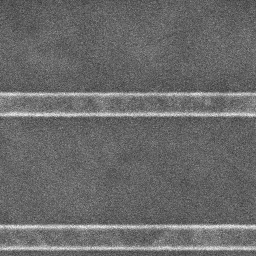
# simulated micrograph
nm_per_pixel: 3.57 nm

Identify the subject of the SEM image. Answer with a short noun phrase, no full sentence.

one or a few lines or trenches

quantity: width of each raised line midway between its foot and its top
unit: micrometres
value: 0.0798